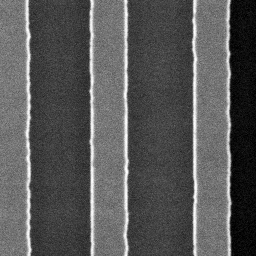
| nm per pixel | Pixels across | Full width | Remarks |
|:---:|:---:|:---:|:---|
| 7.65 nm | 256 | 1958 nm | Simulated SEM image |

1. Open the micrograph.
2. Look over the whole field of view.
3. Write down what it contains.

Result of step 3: lines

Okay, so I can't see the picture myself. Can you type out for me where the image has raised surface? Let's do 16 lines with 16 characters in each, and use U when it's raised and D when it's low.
UUDDDDUUDDDDUUDD
UUDDDDUUDDDDUUDD
UUDDDDUUDDDDUUDD
UUDDDDUUDDDDUUDD
UUDDDDUUDDDDUUDD
UUDDDDUUDDDDUUDD
UUDDDDUUDDDDUUDD
UUDDDDUUDDDDUUDD
UUDDDDUUDDDDUUDD
UUDDDDUUDDDDUUDD
UUDDDDUUDDDDUUDD
UUDDDDUUDDDDUUDD
UUDDDDUUDDDDUUDD
UUDDDDUUDDDDUUDD
UUDDDDUUDDDDUUDD
UUDDDDUUDDDDUUDD